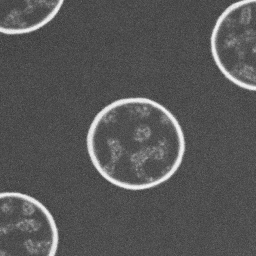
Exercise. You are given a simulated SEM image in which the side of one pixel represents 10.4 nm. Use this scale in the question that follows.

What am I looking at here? raised bodies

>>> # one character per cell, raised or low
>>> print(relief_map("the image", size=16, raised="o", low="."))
oooo...........o
ooo...........oo
.............ooo
.............ooo
..............oo
................
.......ooo......
......ooooo.....
......ooooo.....
......ooooo.....
......ooooo.....
.......ooo......
oo..............
ooo.............
ooo.............
ooo.............